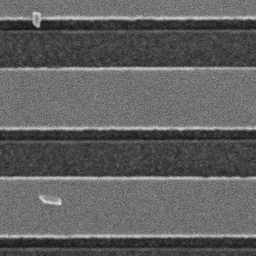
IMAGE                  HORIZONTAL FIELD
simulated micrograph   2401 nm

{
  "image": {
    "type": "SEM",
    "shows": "lines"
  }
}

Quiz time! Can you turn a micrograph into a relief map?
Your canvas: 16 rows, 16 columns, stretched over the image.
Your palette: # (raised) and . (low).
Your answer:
################
................
................
................
################
################
################
################
................
................
................
################
################
################
################
................